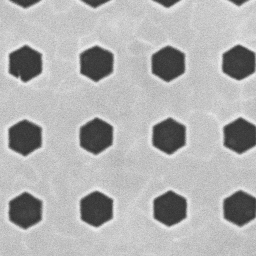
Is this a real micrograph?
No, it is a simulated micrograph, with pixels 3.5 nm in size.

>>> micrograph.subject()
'a regular array of holes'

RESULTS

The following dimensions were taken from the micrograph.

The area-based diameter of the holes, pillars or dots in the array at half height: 119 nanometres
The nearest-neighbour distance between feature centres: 0.249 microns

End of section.